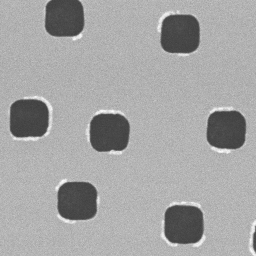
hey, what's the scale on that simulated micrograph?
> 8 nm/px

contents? holes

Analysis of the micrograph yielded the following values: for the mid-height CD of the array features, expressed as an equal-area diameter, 335 nanometres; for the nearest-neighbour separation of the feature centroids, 92.8 pixels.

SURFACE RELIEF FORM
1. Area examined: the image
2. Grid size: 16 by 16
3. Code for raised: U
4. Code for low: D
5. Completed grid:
UUUDDUUUUUUUUUUU
UUUDDUUUUUDDUUUU
UUUUUUUUUUDDUUUU
UUUUUUUUUUUUUUUU
UUUUUUUUUUUUUUUU
UUUUUUUUUUUUUUUU
UDDUUUUUUUUUUUUU
UDDUUUDDUUUUUDDU
UDUUUUDDUUUUUDDU
UUUUUUUUUUUUUUUU
UUUUUUUUUUUUUUUU
UUUUDDUUUUUUUUUU
UUUUDDUUUUUUUUUU
UUUUDDUUUUDDDUUU
UUUUUUUUUUDDDUUU
UUUUUUUUUUUUUUUU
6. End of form